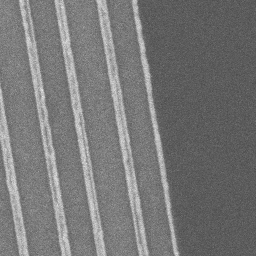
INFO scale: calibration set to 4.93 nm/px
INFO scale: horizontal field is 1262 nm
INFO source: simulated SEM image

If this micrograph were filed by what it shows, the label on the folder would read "parallel lines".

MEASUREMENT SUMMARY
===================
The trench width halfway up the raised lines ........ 134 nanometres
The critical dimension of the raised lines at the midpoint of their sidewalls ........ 7.89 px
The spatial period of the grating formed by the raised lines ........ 190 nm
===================